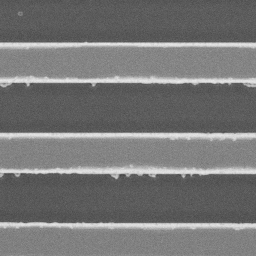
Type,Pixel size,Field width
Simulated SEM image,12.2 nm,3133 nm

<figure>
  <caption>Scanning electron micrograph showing lines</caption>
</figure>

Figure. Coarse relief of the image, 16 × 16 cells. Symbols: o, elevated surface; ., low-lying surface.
................
................
................
oooooooooooooooo
oooooooooooooooo
................
................
................
oooooooooooooooo
oooooooooooooooo
oooooooooooooooo
................
................
................
oooooooooooooooo
oooooooooooooooo